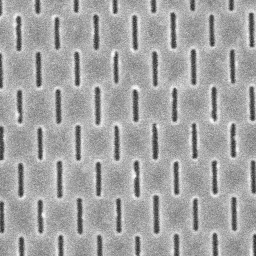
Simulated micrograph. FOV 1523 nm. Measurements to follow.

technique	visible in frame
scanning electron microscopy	a regular array of holes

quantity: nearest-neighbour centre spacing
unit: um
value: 0.228